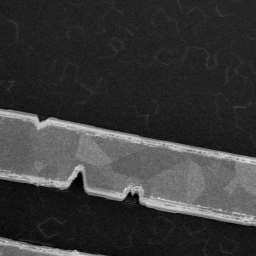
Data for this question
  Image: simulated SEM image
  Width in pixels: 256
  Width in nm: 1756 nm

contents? one or a few lines or trenches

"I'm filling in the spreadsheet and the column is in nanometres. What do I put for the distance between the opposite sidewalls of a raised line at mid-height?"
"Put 420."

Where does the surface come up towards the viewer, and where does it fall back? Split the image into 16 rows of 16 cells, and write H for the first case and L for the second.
LLLLLLLLLLLLLLLL
LLLLLLLLLLLLLLLL
LLLLLLLLLLLLLLLL
LLLLLLLLLLLLLLLL
LLLLLLLLLLLLLLLL
LLLLLLLLLLLLLLLL
LLLLLLLLLLLLLLLL
HHLLLLLLLLLLLLLL
HHHHHHHHLLLLLLLL
HHHHHHHHHHHHHLLL
HHHHHHHHHHHHHHHH
LLLHLHHHHHHHHHHH
LLLLLLLLLHHHHHHH
LLLLLLLLLLLLLHHH
LLLLLLLLLLLLLLLL
HHLLLLLLLLLLLLLL